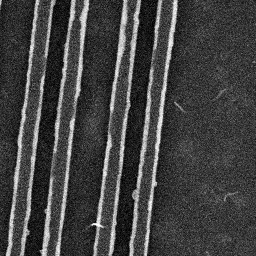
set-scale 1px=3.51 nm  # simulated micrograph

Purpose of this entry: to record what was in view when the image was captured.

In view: parallel lines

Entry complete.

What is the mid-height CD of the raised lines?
63.6 nm